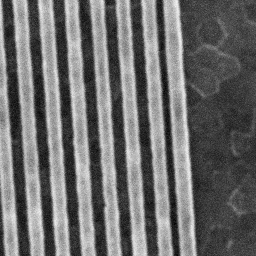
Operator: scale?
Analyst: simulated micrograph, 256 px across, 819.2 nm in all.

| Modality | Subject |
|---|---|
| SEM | parallel lines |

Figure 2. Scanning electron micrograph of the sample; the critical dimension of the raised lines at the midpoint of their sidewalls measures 41 nanometres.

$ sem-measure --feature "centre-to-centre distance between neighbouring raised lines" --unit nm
80.2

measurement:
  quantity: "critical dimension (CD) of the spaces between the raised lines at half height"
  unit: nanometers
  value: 41.4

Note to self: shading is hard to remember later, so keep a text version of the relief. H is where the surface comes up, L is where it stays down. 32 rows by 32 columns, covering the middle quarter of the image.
LHHHHLLLHHHLLLHHHLLLLHHHLLHHHLLL
LLHHHLLLHHHLLLHHHLLLLHHHLLHHHLLL
LLHHLLLLHHHLLLLHHHLLLHHHLLHHHHLL
LLHHLLLLHHHLLLHHHHLLLHHHLLHHHHLL
LLHHHLLLHHHLLLHHHLLLLHHHLLHHHHLL
LLHHHLLLHHHLLLLHHHLLLHHHLLHHHHLL
LLHHHLLLHHHLLLLHHHLLLHHHLLLHHHLL
LLHHHLLLHHHLLLLHHHLLLHHHLLLHHHLL
LLHHHLLLLHHHLLLHHHLLLHHHLLLHHHLL
LLHHHLLLHHHLLLLHHHLLLHHHLLLHHHLL
LLHHHLLLLHHLLLLHHHLLLHHHLLLHHHLL
LLHHHLLLLHHLLLLHHHLLLHHHLLLHHHLL
LLHHHLLLLHHHLLLHHHLLLHHHLLLHHHLL
LLHHHLLLLHHHLLLHHHLLLLHHHLLHHHLL
LLHHHLLLLHHHLLLHHHLLLLHHHLLHHHLL
LLLHHLLLLHHHLLLHHHLLLLHHHLLHHHLL
LLLHHLLLLHHHLLLHHHLLLLHHHLLHHHHL
LLLHHLLLLHHHLLLHHHLLLLHHHLLHHHHL
LLLHHHLLLHHHLLLLHHLLLLHHHLLHHHHL
LLLHHHLLLHHHLLLLHHHLLLHHHLLHHHHL
LLLHHHLLLHHHLLLLHHHLLLHHHLLHHHHL
LLLHHHLLLHHHLLLLHHHLLLHHHLLLHHHL
LLLHHHLLLHHHLLLLHHHLLLHHHLLLHHHL
LLLHHHLLLLHHLLLLHHHLLLHHHLLLHHHL
LLLHHHLLLHHHLLLLHHHLLLHHHLLLHHHL
LLLHHHLLLHHHLLLLHHHLLLHHHLLLHHHL
LLLHHHLLLLHHHLLLHHHLLLLHHLLLHHHL
LLLHHHLLLLHHHLLLHHHLLLLHHHLLHHHH
LLLHHHLLLLHHHLLLHHHLLLLHHHLLHHHH
LLLHHHHLLLHHHLLLHHHLLLLHHHLLHHHH
LLLHHHHLLLHHHLLLHHHLLLLHHHLLHHHH
LLLLHHLLLLHHHLLLHHHLLLLHHHLLHHHH